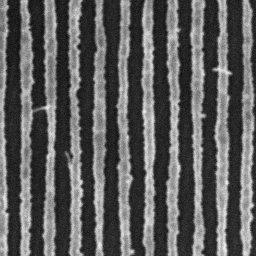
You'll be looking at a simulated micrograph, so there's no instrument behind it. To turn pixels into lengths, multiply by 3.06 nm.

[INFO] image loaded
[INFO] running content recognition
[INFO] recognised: parallel lines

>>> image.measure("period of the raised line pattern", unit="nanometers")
75.3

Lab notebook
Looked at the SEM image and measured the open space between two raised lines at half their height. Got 0.0494 microns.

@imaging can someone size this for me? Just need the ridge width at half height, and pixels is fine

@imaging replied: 8.37